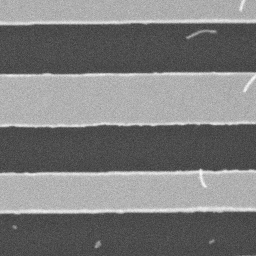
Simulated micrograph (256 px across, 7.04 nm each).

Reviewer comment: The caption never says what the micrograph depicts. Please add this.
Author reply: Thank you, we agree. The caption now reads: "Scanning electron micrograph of lines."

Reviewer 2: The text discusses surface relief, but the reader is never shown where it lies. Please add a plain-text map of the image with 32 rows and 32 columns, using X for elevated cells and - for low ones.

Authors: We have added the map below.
XXXXXXXXXXXXXXXXXXXXXXXXXXXXXXXX
XXXXXXXXXXXXXXXXXXXXXXXXXXXXXXXX
XXXXXXXXXXXXXXXXXXXXXXXXXXXXXXXX
--------------------------------
--------------------------------
--------------------------------
--------------------------------
--------------------------------
--------------------------------
XXXXXXXXXXXXXXXXXXXXXXXXXXXXXXXX
XXXXXXXXXXXXXXXXXXXXXXXXXXXXXXXX
XXXXXXXXXXXXXXXXXXXXXXXXXXXXXXXX
XXXXXXXXXXXXXXXXXXXXXXXXXXXXXXXX
XXXXXXXXXXXXXXXXXXXXXXXXXXXXXXXX
XXXXXXXXXXXXXXXXXXXXXXXXXXXXXXXX
XXXXXXXXXXXXXXXXXXXXXXXXX-XXXX--
--------------------------------
--------------------------------
--------------------------------
--------------------------------
--------------------------------
-----------------------XXXXXXXXX
XXXXXXXXXXXXXXXXXXXXXXXXXXXXXXXX
XXXXXXXXXXXXXXXXXXXXXXXXXXXXXXXX
XXXXXXXXXXXXXXXXXXXXXXXXXXXXXXXX
XXXXXXXXXXXXXXXXXXXXXXXXXXXXXXXX
XXXXXXXXXXXXX-------------------
--------------------------------
--------------------------------
--------------------------------
--------------------------------
--------------------------------